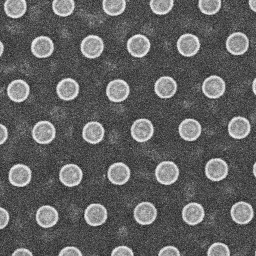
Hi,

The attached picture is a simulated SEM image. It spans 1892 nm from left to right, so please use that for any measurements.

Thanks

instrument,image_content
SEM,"a regular array of raised bodies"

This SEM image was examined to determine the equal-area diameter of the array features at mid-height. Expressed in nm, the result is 153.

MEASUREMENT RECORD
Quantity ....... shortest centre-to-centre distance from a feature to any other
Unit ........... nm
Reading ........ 353